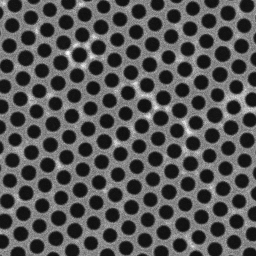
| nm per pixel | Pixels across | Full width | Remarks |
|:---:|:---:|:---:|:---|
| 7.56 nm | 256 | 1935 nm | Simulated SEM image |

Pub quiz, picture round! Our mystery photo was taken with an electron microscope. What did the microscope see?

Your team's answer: a regular array of holes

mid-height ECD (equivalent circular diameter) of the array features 111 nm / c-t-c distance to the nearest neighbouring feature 153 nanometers